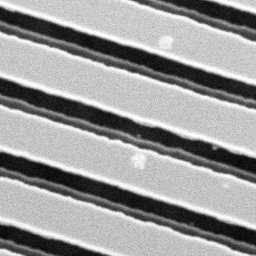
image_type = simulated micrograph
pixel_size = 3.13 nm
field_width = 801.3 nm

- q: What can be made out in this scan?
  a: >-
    lines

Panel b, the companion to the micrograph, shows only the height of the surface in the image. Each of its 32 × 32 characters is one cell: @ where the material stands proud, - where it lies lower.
@@@@@@@@@@@@@@@@@-----------@@@@
---@@@@@@@@@@@@@@@@@@----------@
------@@@@@@@@@@@@@@@@@@--------
---------@@@@@@@@@@@@@@@@@@-----
@-----------@@@@@@@@@@@@@@@@@@--
@@@@@----------@@@@@@@@@@@@@@@@@
@@@@@@@@-----------@@@@@@@@@@@@@
@@@@@@@@@@@-----------@@@@@@@@@@
@@@@@@@@@@@@@@-----------@@@@@@@
@@@@@@@@@@@@@@@@@@----------@@@@
--@@@@@@@@@@@@@@@@@@@----------@
-----@@@@@@@@@@@@@@@@@@@--------
---------@@@@@@@@@@@@@@@@@@-----
@-----------@@@@@@@@@@@@@@@@@@@-
@@@@@----------@@@@@@@@@@@@@@@@@
@@@@@@@@----------@@@@@@@@@@@@@@
@@@@@@@@@@@----------@@@@@@@@@@@
@@@@@@@@@@@@@@-----------@@@@@@@
@@@@@@@@@@@@@@@@@-----------@@@@
--@@@@@@@@@@@@@@@@@@@----------@
------@@@@@@@@@@@@@@@@@@--------
---------@@@@@@@@@@@@@@@@@@-----
@@----------@@@@@@@@@@@@@@@@@@--
@@@@@----------@@@@@@@@@@@@@@@@@
@@@@@@@@----------@@@@@@@@@@@@@@
@@@@@@@@@@@----------@@@@@@@@@@@
@@@@@@@@@@@@@@@----------@@@@@@@
@@@@@@@@@@@@@@@@@----------@@@@@
--@@@@@@@@@@@@@@@@@@@----------@
-----@@@@@@@@@@@@@@@@@@@--------
---------@@@@@@@@@@@@@@@@@@-----
@-----------@@@@@@@@@@@@@@@@@@--